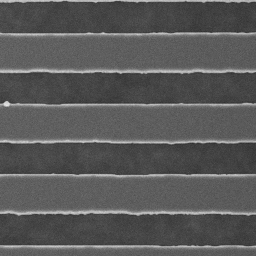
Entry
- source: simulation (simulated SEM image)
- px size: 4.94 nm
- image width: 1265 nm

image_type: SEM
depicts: lines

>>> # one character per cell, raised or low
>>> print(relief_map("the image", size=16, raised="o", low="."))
................
................
oooooooooooooooo
oooooooooooooooo
.o..oooooooo.o..
................
oo.........o...o
oooooooooooooooo
oooooooooooooooo
................
................
oooooooooooooooo
oooooooooooooooo
................
................
oooooooooooooooo